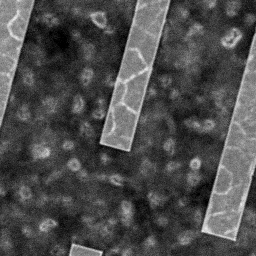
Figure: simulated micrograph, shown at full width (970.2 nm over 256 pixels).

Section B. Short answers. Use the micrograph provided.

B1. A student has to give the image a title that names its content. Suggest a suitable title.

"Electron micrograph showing one or a few lines or trenches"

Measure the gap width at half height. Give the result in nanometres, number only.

346